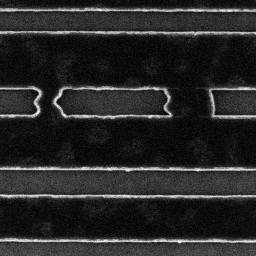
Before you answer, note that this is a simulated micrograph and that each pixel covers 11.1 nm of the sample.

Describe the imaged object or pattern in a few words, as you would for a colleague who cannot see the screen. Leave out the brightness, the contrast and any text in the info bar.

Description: one or a few lines or trenches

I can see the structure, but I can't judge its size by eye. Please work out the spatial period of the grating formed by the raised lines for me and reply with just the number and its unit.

877 nanometers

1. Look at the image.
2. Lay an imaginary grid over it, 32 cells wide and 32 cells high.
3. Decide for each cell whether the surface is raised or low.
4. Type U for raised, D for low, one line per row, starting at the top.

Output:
UUUUUUUUUUUUUUUUUUUUUUUUUUUUUUUU
DDDDDDDDDDDDDDDDDDDDDDDDDDDDDDDD
DDDDDDDDDDDDDDDDDDDDDDDDDDDDDDDD
DDDDDDDDDDDDDDDDDDDDDDDDDDDDDDDD
UUUUUUUUUUUUUUUUUUUUUUUUUUUUUUUU
UUUUUUUUUUUUUUUUUUUUUUUUUUUUUUUU
UUUUUUUUUUUUUUUUUUUUUUUUUUUUUUUU
UUUUUUUUUUUUUUUUUUUUUUUUUUUUUUUU
UUUUUUUUUUUUUUUUUUUUUUUUUUUUUUUU
UUUUUUUUUUUUUUUUUUUUUUUUUUUUUUUU
UUUUUUUUUUUUUUUUUUUUUUUUUUUUUUUU
DDDDDUUUDDDDDDDDDDDDDUUUUUUDDDDD
DDDDUUUDDDDDDDDDDDDDDUUUUUUDDDDD
DDDDDUUUDDDDDDDDDDDDDUUUUUUDDDDD
UUUUUUUUUUUUUUUUUDDUUUUUUUUDDDDD
UUUUUUUUUUUUUUUUUUUUUUUUUUUUUUUU
UUUUUUUUUUUUUUUUUUUUUUUUUUUUUUUU
UUUUUUUUUUUUUUUUUUUUUUUUUUUUUUUU
UUUUUUUUUUUUUUUUUUUUUUUUUUUUUUUU
UUUUUUUUUUUUUUUUUUUUUUUUUUUUUUUU
UUUUUUUUUUUUUUUUUUUUUUUUUUUUUUUU
DDDDDDDDDDDDDDDDDDDDDDDDDDDDDDDD
DDDDDDDDDDDDDDDDDDDDDDDDDDDDDDDD
DDDDDDDDDDDDDDDDDDDDDDDDDDDDDDDD
UUUUUUUDDUUUUUUUUDUUUDUDUUDDUUUU
UUUUUUUUUUUUUUUUUUUUUUUUUUUUUUUU
UUUUUUUUUUUUUUUUUUUUUUUUUUUUUUUU
UUUUUUUUUUUUUUUUUUUUUUUUUUUUUUUU
UUUUUUUUUUUUUUUUUUUUUUUUUUUUUUUU
UUUUUUUUUUUUUUUUUUUUUUUUUUUUUUUU
DDDDDDDDDDDDDDDDDDDDDDDDDDDDDDDD
DDDDDDDDDDDDDDDDDDDDDDDDDDDDDDDD